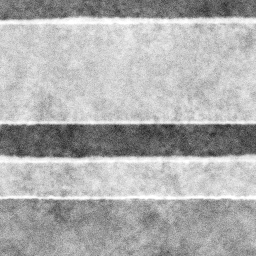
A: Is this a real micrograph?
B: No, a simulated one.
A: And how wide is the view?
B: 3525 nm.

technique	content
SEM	lines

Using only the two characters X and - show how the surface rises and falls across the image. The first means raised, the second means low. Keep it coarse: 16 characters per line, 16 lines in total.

----------------
XXXXXXXXXXXXXXXX
XXXXXXXXXXXXXXXX
XXXXXXXXXXXXXXXX
XXXXXXXXXXXXXXXX
XXXXXXXXXXXXXXXX
XXXXXXXXXXXXXXXX
XXXXXXXXXXXXXXXX
----------------
----------------
XXXXXXXXXXXXXXXX
XXXXXXXXXXXXXXXX
----------------
----------------
----------------
----------------